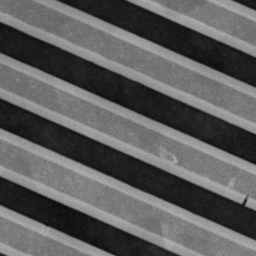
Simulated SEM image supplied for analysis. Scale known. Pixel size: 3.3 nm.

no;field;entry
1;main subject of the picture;one or a few lines or trenches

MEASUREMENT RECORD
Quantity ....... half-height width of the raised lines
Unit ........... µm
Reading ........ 0.106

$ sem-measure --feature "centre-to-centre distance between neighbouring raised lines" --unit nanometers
232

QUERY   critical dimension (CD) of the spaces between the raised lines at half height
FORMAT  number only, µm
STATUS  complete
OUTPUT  0.124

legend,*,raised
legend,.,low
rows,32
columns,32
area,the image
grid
******............**********....
*********............**********.
.**********............*********
...**********............*******
......**********............****
........**********............**
..........**********............
............**********..........
***............**********.......
*****............**********.....
*******............**********...
**********............**********
..**********............********
....**********............******
.......*********............****
.........**********............*
...........**********...........
**...........**********.........
****............**********......
******............**********....
*********...........**********..
***********............*********
...**********............*******
.....**********............*****
.......***********...........***
.........***********............
............**********..........
***...........***********.......
*****...........***********.....
*******............**********...
*********............**********.
.***********...........*********